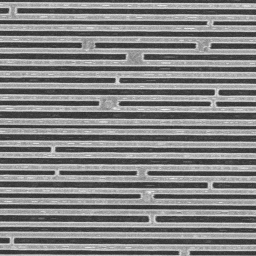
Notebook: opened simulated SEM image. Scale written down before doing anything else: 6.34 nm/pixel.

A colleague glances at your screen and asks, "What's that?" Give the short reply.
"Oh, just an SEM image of parallel lines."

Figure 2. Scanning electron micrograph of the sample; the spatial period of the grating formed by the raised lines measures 0.0731 µm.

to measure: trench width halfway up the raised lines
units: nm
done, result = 37.3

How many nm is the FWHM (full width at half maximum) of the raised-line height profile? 37.3